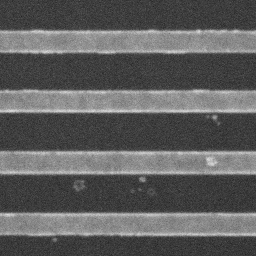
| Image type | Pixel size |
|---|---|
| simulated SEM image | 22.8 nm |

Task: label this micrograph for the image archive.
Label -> lines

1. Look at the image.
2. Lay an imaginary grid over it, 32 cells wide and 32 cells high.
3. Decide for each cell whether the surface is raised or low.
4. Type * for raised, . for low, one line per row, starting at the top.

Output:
................................
................................
................................
................................
********************************
********************************
................................
................................
................................
................................
................................
********************************
********************************
********************************
................................
................................
................................
................................
................................
********************************
********************************
********************************
................................
................................
................................
................................
................................
********************************
********************************
................................
................................
................................